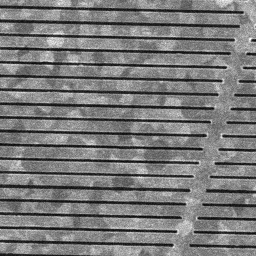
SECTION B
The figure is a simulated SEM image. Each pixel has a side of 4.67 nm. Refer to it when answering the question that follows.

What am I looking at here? parallel lines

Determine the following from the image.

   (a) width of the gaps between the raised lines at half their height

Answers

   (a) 0.0169 µm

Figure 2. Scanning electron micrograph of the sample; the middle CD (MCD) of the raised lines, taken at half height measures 0.0508 microns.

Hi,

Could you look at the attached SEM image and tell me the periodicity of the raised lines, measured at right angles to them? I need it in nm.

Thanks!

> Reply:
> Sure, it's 64.3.